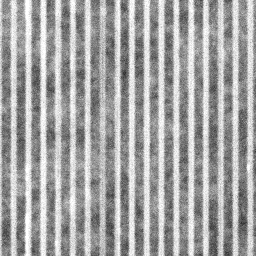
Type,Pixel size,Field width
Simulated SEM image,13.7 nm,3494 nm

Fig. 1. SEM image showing parallel lines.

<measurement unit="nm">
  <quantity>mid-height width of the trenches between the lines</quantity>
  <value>164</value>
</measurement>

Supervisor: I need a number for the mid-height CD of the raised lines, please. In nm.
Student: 37.5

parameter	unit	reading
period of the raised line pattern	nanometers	202